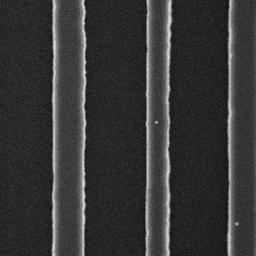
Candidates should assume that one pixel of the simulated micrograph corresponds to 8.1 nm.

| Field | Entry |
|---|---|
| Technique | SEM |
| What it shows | lines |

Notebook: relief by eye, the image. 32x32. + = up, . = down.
.......+++........+++........+++
.......++++........++........+++
.......+++.........++........+++
.......+++.........++........+++
.......++++........++........+++
.......++++........++........+++
.......++++........++........+++
.......++++.......+++........+++
.......++++.......+++........+++
.......++++.......+++........+++
.......++++.......+++........+++
.......++++.......+++........+++
.......+++........+++........+++
.......+++.........++........+++
.......++++........++........+++
.......++++.......+++........+++
.......++++.......+++........+++
.......++++.......+++........+++
.......+++.........++........+++
.......+++.........++........+++
.......+++........+++........+++
.......+++........+++........+++
.......+++........+++........+++
.......+++........+++........+++
.......+++........+++........+++
.......++++.......+++........+++
.......+++........+++........+++
.......+++........+++........+++
.......+++........+++........+++
.......+++........+++........+++
.......+++........+++........+++
.......+++........+++........+++